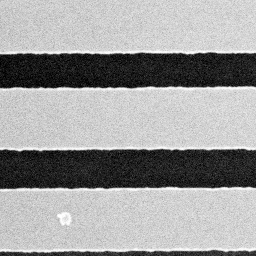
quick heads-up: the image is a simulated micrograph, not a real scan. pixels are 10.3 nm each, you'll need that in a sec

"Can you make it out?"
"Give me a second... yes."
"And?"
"lines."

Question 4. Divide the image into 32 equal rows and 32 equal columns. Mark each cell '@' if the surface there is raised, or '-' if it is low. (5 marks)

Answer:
@@@@@@@@@@@@@@@@@@@@@@@@@@@@@@@@
@@@@@@@@@@@@@@@@@@@@@@@@@@@@@@@@
@@@@@@@@@@@@@@@@@@@@@@@@@@@@@@@@
@@@@@@@@@@@@@@@@@@@@@@@@@@@@@@@@
@@@@@@@@@@@@@@@@@@@@@@@@@@@@@@@@
@@@@@@@@@@@@@@@@@@@@@@@@@@@@@@@@
@@@@@@@@@@@@@@@@@@@@@@@@@@-@@@@@
--------------------------------
--------------------------------
--------------------------------
--------------------------------
@@@@@@@@@@@@@@@@@@@@@@@@@@@@@@@@
@@@@@@@@@@@@@@@@@@@@@@@@@@@@@@@@
@@@@@@@@@@@@@@@@@@@@@@@@@@@@@@@@
@@@@@@@@@@@@@@@@@@@@@@@@@@@@@@@@
@@@@@@@@@@@@@@@@@@@@@@@@@@@@@@@@
@@@@@@@@@@@@@@@@@@@@@@@@@@@@@@@@
@@@@@@@@@@@@@@@@@@@@@@@@@@@@@@@@
@@@@@@@@@@@@@@@@@@@@@@@@@@@@@@@@
--------------------------------
--------------------------------
--------------------------------
--------------------------------
------------------@-@@@----@@@@@
@@@@@@@@@@@@@@@@@@@@@@@@@@@@@@@@
@@@@@@@@@@@@@@@@@@@@@@@@@@@@@@@@
@@@@@@@@@@@@@@@@@@@@@@@@@@@@@@@@
@@@@@@@@@@@@@@@@@@@@@@@@@@@@@@@@
@@@@@@@@@@@@@@@@@@@@@@@@@@@@@@@@
@@@@@@@@@@@@@@@@@@@@@@@@@@@@@@@@
@@@@@@@@@@@@@@@@@@@@@@@@@@@@@@@@
--------------------------------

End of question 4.